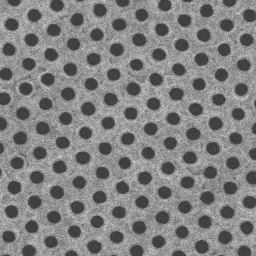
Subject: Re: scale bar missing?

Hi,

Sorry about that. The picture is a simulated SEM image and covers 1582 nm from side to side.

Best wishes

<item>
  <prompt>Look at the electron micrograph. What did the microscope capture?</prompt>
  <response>a regular array of holes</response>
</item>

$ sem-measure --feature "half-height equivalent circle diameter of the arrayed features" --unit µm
0.0791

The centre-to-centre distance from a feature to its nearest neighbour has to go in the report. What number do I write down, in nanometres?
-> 150